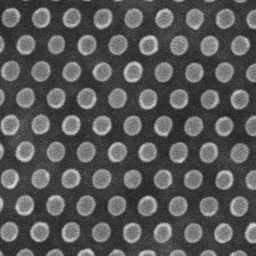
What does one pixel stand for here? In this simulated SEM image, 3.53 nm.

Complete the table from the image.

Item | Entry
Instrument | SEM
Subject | a regular array of raised bodies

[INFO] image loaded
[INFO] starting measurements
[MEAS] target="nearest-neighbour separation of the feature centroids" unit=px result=30.2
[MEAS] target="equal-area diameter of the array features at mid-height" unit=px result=18.4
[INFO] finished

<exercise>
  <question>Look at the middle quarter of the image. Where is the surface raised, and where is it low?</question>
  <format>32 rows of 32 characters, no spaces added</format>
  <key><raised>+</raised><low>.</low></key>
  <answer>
++++....+++.....+++....++++....+
++++...+++++...++++....++++....+
++++...+++++...++++....++++....+
+++.....+++....++++....+++.....+
................................
................................
.....++......+..................
....++++....+++....++++....++++.
....++++...++++....++++....++++.
....++++...++++....++++....++++.
....+++.....++.....++++....+++..
................................
................................
.+++....+++.....++......++......
++++....++++...++++....++++....+
++++...+++++...++++....++++...++
++++...++++....++++....++++...++
.++.....++......++.....+++.....+
................................
................................
....+++.....+++....++++....+++..
...++++....++++....++++....++++.
...++++....++++....++++....++++.
....+++....++++....+++.....+++..
............................++..
................................
.++.............................
++++....+++....++++....++++....+
++++...++++....++++....++++...++
++++...++++....++++....++++...++
+++.....+++.....++.....+++.....+
................................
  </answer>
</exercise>